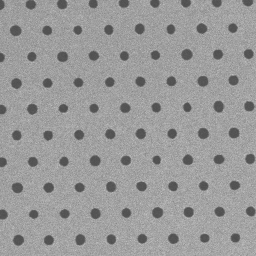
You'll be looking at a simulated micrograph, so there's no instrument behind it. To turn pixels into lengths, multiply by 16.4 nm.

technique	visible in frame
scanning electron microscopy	a regular array of holes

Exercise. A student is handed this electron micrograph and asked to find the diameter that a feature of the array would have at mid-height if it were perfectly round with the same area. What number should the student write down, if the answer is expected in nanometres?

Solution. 166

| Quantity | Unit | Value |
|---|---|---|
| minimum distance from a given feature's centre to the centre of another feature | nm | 493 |